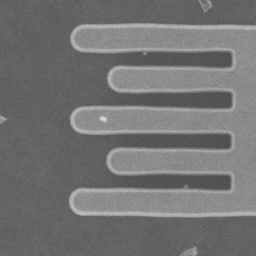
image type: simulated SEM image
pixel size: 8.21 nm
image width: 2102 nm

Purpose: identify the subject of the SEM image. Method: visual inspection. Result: groups of lines, slits or small figures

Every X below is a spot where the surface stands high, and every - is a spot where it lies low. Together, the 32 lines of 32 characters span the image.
--------------------------------
--------------------------------
--------------------------------
----------XXXXXXXXXXXXXXXXXXXXXX
---------XXXXXXXXXXXXXXXXXXXXXXX
---------XXXXXXXXXXXXXXXXXXXXXXX
-----------------------------XXX
-----------------------------XXX
--------------XXXXXXXXXXX----XXX
--------------XXXXXXXXXXXXXXXXXX
--------------XXXXXXXXXXXXXXXXXX
-----------------X-----------XXX
-----------------------------XXX
----------XXXXXXXXXXXX-------XXX
---------XXXXXXXXXXXXXXXXXXXXXXX
---------XXXXXXXXXXXXXXXXXXXXXXX
----------XXXXXXXXXXXXXXXXXXXXXX
-----------------------------XXX
-----------------------------XXX
--------------XXXXXXXXXXXXXXXXXX
--------------XXXXXXXXXXXXXXXXXX
--------------XXXXXXXXXXXXXXXXXX
-----------------------------XXX
-----------------------------XXX
---------XXXXXXXXXXXXXXXXXXXXXXX
---------XXXXXXXXXXXXXXXXXXXXXXX
----------XXXXXXXXXXXXXXXXXXXXXX
--------------------------------
--------------------------------
--------------------------------
--------------------------------
--------------------------------